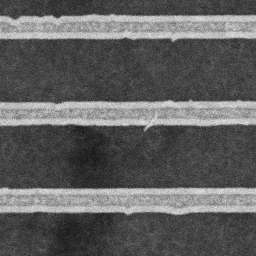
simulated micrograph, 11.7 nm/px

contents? one or a few lines or trenches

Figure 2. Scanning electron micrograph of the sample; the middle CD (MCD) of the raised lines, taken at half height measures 208 nm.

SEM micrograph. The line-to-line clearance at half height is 68.5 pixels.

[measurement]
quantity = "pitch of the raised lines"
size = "1010 nm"